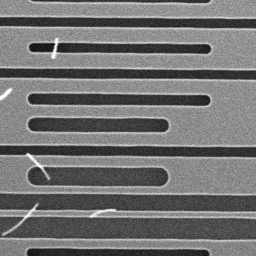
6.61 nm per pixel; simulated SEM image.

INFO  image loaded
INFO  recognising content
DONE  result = groups of lines, slits or small figures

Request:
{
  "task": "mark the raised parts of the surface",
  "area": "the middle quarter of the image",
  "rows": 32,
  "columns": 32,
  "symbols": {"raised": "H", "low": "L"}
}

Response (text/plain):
HHHHHHHHHHHHHHHHHHHHHHHHHHHHHHHH
LLLLLLLLLLLLLLLLLLLLLLLLLLLLLLLL
LLLLLLLLLLLLLLLLLLLLLLLLLLLLLLLL
LLLLLLLLLLLLLLLLLLLLLLLLLLLLLLLL
HHHHHHHHHHHHHHHHHHHHHHHHHHHHHHHH
HHHHHHHHHHHHHHHHHHHHHHHHHHHHHHHH
HHHHHHHHHHHHHHHHHHHHHHHHHHHHHHHH
LLLLLLLLLLLLLLLLLLLLLLLLHHHHHHHH
LLLLLLLLLLLLLLLLLLLLLLLLLLLLLLLL
LLLLLLLLLLLLLLLLLLLLLLLLLLLLLLLL
LLLLLLLLLLLLLLLLLLLLLLLLLLLLLLLL
HHHHHHHHHHHHHHHHHHHHHHHHHHHHHHHH
HHHHHHHHHHHHHHHHHHHHHHHHHHHHHHHH
LLLLLLLLLLLHHHHLLLLLLHHHHHHHHHHH
LLLLLLLLLLLLLLLLLLLLLLLLLLHHHHHH
LLLLLLLLLLLLLLLLLLLLLLLLLLHHHHHH
LLLLLLLLLLLLLLLLLLLLLLLLLLHHHHHH
HHHHHHHHHHHHHHHHHHHHHHHHHHHHHHHH
HHHHHHHHHHHHHHHHHHHHHHHHHHHHHHHH
HHHHHHHHHHHHHHHHHHHHHHHHHHHHHHHH
LLLLLLLLLLLLLLLLLLLLLLLLLLLLLLLL
LLLLLLLLLLLLLLLLLLLLLLLLLLLLLLLL
LLLLLLLLLLLLLLLLLLLLLLLLLLLLLLLL
HHHHHHHHHHHHHHHHHHHHHHHHHHHHHHHH
HHHHHHHHHHHHHHHHHHHHHHHHHHHHHHHH
HHHHHHHHHHHHHHHHHHHHHHHHHHHHHHHH
LLLLLLLLLLLLLLLLLLLLLLLLLHHHHHHH
LLLLLLLLLLLLLLLLLLLLLLLLLLHHHHHH
LLLLLLLLLLLLLLLLLLLLLLLLLLHHHHHH
LLLLLLLLLLLLLLLLLLLLLLLLLLHHHHHH
HHHLLLLLLLLLLLLLLLLLLLLLHHHHHHHH
HHHHHHHHHHHHHHHHHHHHHHHHHHHHHHHH